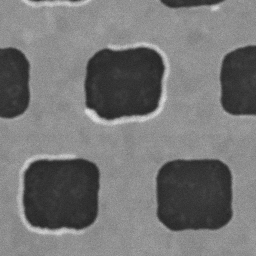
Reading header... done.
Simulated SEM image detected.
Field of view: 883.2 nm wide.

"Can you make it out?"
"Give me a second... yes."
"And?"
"holes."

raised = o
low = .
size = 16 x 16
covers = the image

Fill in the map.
oooooooooooooooo
oooooooooooooooo
oooooooooooooooo
..oooo....oooo..
..ooo.....oooo..
..ooo.....oooo..
..ooo.....oooo..
oooooooooooooooo
oooooooooooooooo
oooooooooooooooo
oo....oooo....oo
o.....oooo.....o
o.....oooo.....o
oo....oooo.....o
oooooooooooooooo
oooooooooooooooo